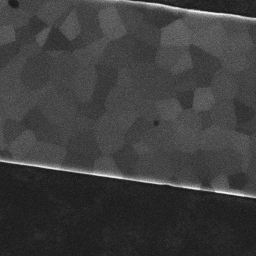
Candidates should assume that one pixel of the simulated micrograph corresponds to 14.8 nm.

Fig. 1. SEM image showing one or a few lines or trenches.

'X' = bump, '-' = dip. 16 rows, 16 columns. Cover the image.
XXXXXXXXXXX-----
XXXXXXXXXXXXXXXX
XXXXXXXXXXXXXXXX
XXXXXXXXXXXXXXXX
XXXXXXXXXXXXXXXX
XXXXXXXXXXXXXXXX
XXXXXXXXXXXXXXXX
XXXXXXXXXXXXXXXX
XXXXXXXXXXXXXXXX
XXXXXXXXXXXXXXXX
---XXXXXXXXXXXXX
----------XXXXXX
----------------
----------------
----------------
----------------